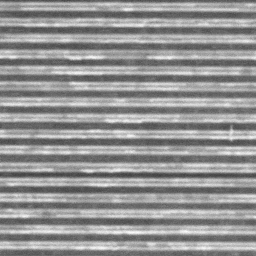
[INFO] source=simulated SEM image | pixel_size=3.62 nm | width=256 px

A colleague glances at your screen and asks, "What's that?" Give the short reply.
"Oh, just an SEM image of parallel lines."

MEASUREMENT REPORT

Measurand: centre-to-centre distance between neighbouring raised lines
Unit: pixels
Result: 15.9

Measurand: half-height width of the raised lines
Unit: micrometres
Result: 0.0267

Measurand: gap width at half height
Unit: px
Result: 8.4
